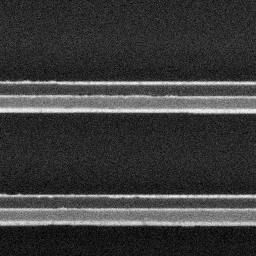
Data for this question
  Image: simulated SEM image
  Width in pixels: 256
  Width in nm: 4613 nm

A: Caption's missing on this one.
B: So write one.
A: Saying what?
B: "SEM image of lines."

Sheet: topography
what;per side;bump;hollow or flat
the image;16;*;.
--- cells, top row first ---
................
................
................
................
................
****************
****************
................
................
................
................
................
****************
****************
................
................